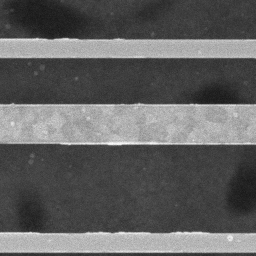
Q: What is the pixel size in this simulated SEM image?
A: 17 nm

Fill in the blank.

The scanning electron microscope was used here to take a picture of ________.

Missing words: lines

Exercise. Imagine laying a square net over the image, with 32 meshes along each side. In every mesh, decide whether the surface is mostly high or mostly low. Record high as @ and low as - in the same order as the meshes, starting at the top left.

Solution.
--------------------------------
--------------------------------
--------------------------------
--------------------------------
--------------------------------
@@@@@@@@@@@@@@@@@@@@@@@@@@@@@@@@
@@@@@@@@@@@@@@@@@@@@@@@@@@@@@@@@
--------------------------------
--------------------------------
--------------------------------
--------------------------------
--------------------------------
--------------------------------
@@@@@@@@@@@@@@@@@@@@@@@@@@@@@@@@
@@@@@@@@@@@@@@@@@@@@@@@@@@@@@@@@
@@@@@@@@@@@@@@@@@@@@@@@@@@@@@@@@
@@@@@@@@@@@@@@@@@@@@@@@@@@@@@@@@
@@@@@@@@@@@@@@@@@@@@@@@@@@@@@@@@
--------------------------------
--------------------------------
--------------------------------
--------------------------------
--------------------------------
--------------------------------
--------------------------------
--------------------------------
--------------------------------
--------------------------------
--------------------------------
@@@@@@@@@@@@@@@@@@@@@@@@@@@@@@@@
@@@@@@@@@@@@@@@@@@@@@@@@@@@@@@@@
--------------------------------